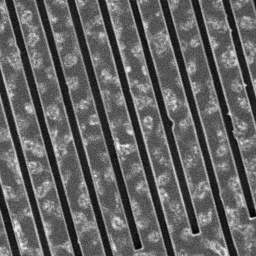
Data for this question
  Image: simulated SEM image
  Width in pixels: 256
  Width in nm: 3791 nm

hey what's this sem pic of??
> parallel lines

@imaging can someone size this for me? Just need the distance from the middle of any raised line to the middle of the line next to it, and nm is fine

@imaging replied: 442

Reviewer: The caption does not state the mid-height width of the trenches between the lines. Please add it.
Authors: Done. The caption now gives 120 nanometres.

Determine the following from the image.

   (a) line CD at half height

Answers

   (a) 318 nm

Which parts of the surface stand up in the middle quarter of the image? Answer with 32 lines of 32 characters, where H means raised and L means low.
HHHHHLLHHHHHHLLHHHHHHLLHHHHHLLLH
HHHHHLLHHHHHHLLHHHHHHLLHHHHHHLLH
HHHHHHLLHHHHHLLLHHHHHLLHHHHHHLLH
HHHHHHLLHHHHHHLLHHHHHHLHHHHHHLLH
LHHHHHLLHHHHHHLLHHHHHHLLHHHHHLLL
LHHHHHLLLHHHHHLLHHHHHHLLHHHHHHLL
LHHHHHHLLHHHHHHLLHHHHHLLHHHHHHLL
LHHHHHHLLHHHHHHLLHHHHHLLLHHHHHLL
LLHHHHHLLLHHHHHLLHHHHHHLLHHHHHHL
LLHHHHHLLLHHHHHLLHHHHHHLLHHHHHHL
LLHHHHHHLLHHHHHHLLHHHHHLLHHHHHHL
LLLHHHHHLLHHHHHHLLHHHHHHLLHHHHHL
HLLHHHHHLLLHHHHHLLHHHHHHLLHHHHHH
HLLHHHHHHLLHHHHHLLLHHHHHLLHHHHHH
HLLHHHHHHLLHHHHHHLLHHHHHLLLHHHHH
HHLLHHHHHLLHHHHHHLLHHHHHHLLHHHHH
HHLLHHHHHLLLHHHHHLLHHHHHHLLHHHHH
HHLLHHHHHHLLHHHHHHLLHHHHHLLLHHHH
HHLLHHHHHHLLHHHHHHLLHHHHHLLLHHHH
HHHLLHHHHHLLLHHHHHLLHHHHHHLLHHHH
HHHLLHHHHHLLLHHHHHLLHHHHHHLLHHHH
HHHLLHHHHHHLLHHHHHHLLHHHHHLLLHHH
HHHLLLHHHHHLLHHHHHHLLHHHHHHLLHHH
HHHHLLHHHHHLLHHHHHHLLHHHHHHLLHHH
HHHHLLHHHHHHLLHHHHHLLLHHHHHLLHHH
HHHHLLHHHHHHLLHHHHHHLLHHHHHLLLHH
HHHHHLLHHHHHLLHHHHHHLLHHHHHHLLHH
HHHHHLLHHHHHLLLHHHHHLLHHHHHHLLHH
HHHHHLLHHHHHHLLHHHHHHLLHHHHHLLLH
HHHHHLLHHHHHHLLHHHHHHLLHHHHHLLLH
HHHHHHLLHHHHHLLLHHHHHLLHHHHHHLLH
HHHHHHLLHHHHHLLLHHHHHLLHHHHHHLLH